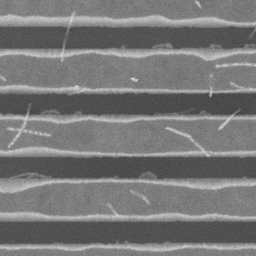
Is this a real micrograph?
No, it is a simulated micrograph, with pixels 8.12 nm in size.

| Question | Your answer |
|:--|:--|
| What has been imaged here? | lines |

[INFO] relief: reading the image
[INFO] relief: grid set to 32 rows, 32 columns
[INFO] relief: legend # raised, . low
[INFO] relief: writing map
################################
################################
################################
................................
................................
................................
####...#########..#######...####
################################
################################
################################
################################
.........#..........#########...
................................
................................
...#.........................#..
################################
################################
################################
################################
..............#.#...............
................................
................................
......#############.............
################################
################################
################################
################################
.......###....................##
................................
................................
................................
################################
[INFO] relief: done